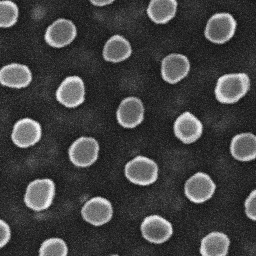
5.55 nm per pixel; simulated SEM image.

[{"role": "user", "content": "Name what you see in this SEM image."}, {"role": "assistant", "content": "a regular array of raised bodies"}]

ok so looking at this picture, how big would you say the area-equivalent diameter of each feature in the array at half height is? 0.154 µm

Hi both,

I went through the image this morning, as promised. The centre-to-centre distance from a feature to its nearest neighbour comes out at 59.6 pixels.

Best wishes